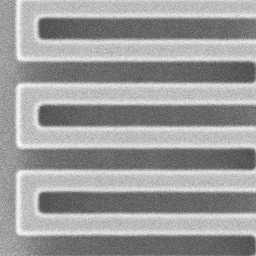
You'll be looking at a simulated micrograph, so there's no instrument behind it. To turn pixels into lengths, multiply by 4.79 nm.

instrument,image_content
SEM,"groups of lines, slits or small figures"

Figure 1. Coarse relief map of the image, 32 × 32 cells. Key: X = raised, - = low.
--XXXXXXXXXXXXXXXXXXXXXXXXXXXXXX
--XXXXXXXXXXXXXXXXXXXXXXXXXXXXXX
--XXX---------------------------
--XXX---------------------------
--XXX---------------------------
--XXXXXXXXXXXXXXXXXXXXXXXXXXXXXX
--XXXXXXXXXXXXXXXXXXXXXXXXXXXXXX
---XXXXXXXXXXXXXXXXXXXXXXXXXXXXX
--------------------------------
--------------------------------
-------------------------------X
--XXXXXXXXXXXXXXXXXXXXXXXXXXXXXX
--XXXXXXXXXXXXXXXXXXXXXXXXXXXXXX
--XXX---------------------------
--XXX---------------------------
--XXX---------------------------
--XXXXXXXXXXXXXXXXXXXXXXXXXXXXXX
--XXXXXXXXXXXXXXXXXXXXXXXXXXXXXX
-------------------------------X
--------------------------------
--------------------------------
---XXXXXXXXXXXXXXXXXXXXXXXXXXXXX
--XXXXXXXXXXXXXXXXXXXXXXXXXXXXXX
--XXXXXXXXXXXXXXXXXXXXXXXXXXXXXX
--XXX---------------------------
--XXX---------------------------
--XXX---------------------------
--XXXXXXXXXXXXXXXXXXXXXXXXXXXXXX
--XXXXXXXXXXXXXXXXXXXXXXXXXXXXXX
--------------------------------
--------------------------------
--------------------------------